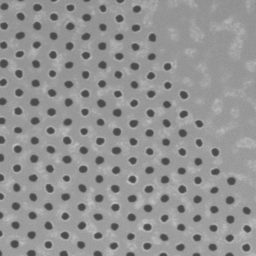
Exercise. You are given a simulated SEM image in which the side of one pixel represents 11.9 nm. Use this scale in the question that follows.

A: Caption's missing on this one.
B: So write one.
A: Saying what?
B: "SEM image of a regular array of holes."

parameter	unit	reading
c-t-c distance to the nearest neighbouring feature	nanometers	222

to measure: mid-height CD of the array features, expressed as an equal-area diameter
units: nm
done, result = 95.2